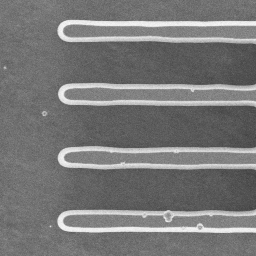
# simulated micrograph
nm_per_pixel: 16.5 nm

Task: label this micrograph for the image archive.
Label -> groups of lines, slits or small figures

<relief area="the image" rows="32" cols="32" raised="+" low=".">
................................
................................
................................
........++++++++++++++++++++++++
........++++++++++++++++++++++++
................................
................................
................................
................................
................................
................................
........++++++++++++++++++++++++
........++++++++++++++++++++++++
................................
................................
................................
................................
................................
................................
........++++++++++++++++++++++++
........++++++++++++++++++++++++
................................
................................
................................
................................
................................
.....................+..........
........++++++++++++++++++++++++
........++++++++++++++++++++++++
................................
................................
................................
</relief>